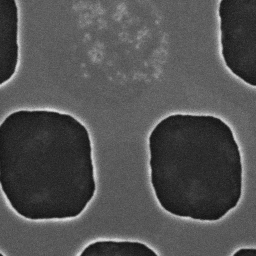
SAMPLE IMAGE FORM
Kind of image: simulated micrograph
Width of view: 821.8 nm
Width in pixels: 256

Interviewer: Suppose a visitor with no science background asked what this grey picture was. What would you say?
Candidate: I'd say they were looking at holes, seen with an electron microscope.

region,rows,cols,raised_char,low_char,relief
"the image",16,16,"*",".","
.*************..
.*************..
.*************..
.*************..
.**************.
****************
****************
.....*****....**
......***......*
......***......*
......***......*
......****.....*
......****.....*
*....******...**
****************
*****....*******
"